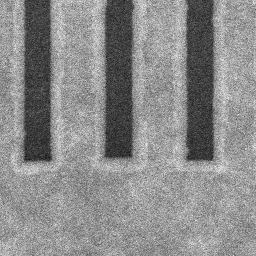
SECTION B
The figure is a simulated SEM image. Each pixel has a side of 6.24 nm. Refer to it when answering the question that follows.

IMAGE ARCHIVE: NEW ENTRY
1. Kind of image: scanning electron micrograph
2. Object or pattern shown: one or a few lines or trenches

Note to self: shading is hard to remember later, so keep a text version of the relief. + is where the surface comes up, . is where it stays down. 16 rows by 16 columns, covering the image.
+...++...++...++
+...++...++...++
+...++...++...++
+...++...++...++
+..+++...++...++
+..+++...++...++
+..+++...++...++
+..+++...++...++
+..+++...++...++
+..+++...++...++
++++++++++++++++
++++++++++++++++
++++++++++++++++
++++++++++++++++
++++++++++++++++
++++++++++++++++